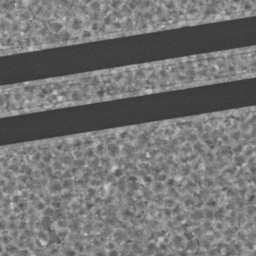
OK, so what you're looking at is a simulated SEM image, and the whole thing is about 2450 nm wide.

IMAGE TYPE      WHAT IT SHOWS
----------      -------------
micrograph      one or a few lines or trenches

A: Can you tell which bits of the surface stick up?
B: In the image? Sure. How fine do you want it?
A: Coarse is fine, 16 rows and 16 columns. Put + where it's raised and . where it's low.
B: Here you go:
++++++++++++++++
+++++++++++.....
+++++...........
.............+++
......++++++++++
+++++++++++.....
++++............
...........+++++
.....+++++++++++
++++++++++++++++
++++++++++++++++
++++++++++++++++
++++++++++++++++
++++++++++++++++
++++++++++++++++
++++++++++++++++